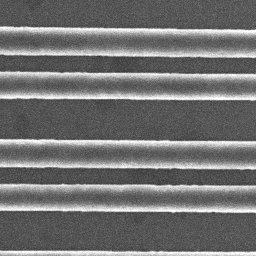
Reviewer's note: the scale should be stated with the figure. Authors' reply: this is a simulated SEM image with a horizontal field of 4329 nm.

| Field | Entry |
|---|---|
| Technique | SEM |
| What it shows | lines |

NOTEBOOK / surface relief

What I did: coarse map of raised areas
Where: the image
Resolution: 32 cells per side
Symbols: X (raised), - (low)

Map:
--------------------------------
--------------------------------
--------------------------------
--------------------------------
XXXXXXXXXXXXXXXXXXXXXXXXXXXXXXXX
XXXXXXXXXXXXXXXXXXXXXXXXXXXXXXXX
XXXXXXXXXXXXXXXXXXXXXXXXXXXXXXXX
--------------------------------
--------------------------------
XXXXXXXXXXXXXXXXXXXXXXXXXXXXXXXX
XXXXXXXXXXXXXXXXXXXXXXXXXXXXXXXX
XXXXXXXXXXXXXXXXXXXXXXXXXXXXXXXX
--------------------------------
--------------------------------
--------------------------------
--------------------------------
--------------------------------
--------------------------------
XXXXXXXXXXXXXXXXXXXXXXXXXXXXXXXX
XXXXXXXXXXXXXXXXXXXXXXXXXXXXXXXX
XXXXXXXXXXXXXXXXXXXXXXXXXXXXXXXX
--------------------------------
--------------------------------
XXXXXXXXXXXXXXXXXXXXXXXXXXXXXXXX
XXXXXXXXXXXXXXXXXXXXXXXXXXXXXXXX
XXXXXXXXXXXXXXXXXXXXXXXXXXXXXXXX
--------------------------------
--------------------------------
--------------------------------
--------------------------------
--------------------------------
--------------------------------